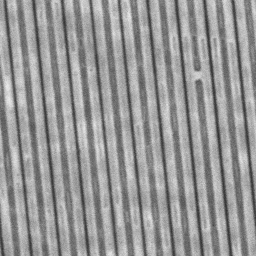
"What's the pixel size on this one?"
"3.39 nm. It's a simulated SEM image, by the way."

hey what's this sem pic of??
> parallel lines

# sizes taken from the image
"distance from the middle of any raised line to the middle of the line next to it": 48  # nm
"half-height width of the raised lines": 31.6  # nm